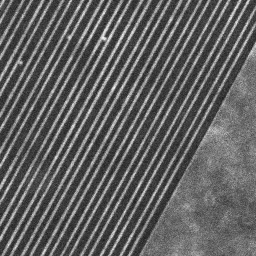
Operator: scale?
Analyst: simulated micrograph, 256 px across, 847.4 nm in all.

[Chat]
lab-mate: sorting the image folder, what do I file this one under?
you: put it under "parallel lines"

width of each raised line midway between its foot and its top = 1.96 px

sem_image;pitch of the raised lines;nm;28.5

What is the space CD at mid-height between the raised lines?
24.3 nanometers